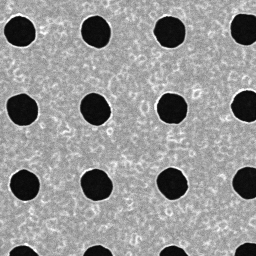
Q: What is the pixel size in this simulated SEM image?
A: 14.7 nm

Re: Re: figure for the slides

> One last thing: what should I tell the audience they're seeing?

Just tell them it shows a regular array of holes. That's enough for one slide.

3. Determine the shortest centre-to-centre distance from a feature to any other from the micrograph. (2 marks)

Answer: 1090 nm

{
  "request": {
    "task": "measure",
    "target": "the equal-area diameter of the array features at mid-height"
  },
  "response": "0.46 um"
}